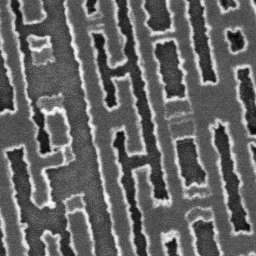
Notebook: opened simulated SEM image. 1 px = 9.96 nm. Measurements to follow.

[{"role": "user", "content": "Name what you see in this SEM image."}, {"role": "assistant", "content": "parallel lines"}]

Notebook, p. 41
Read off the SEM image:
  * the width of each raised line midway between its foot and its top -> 185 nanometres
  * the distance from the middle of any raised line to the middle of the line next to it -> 343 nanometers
